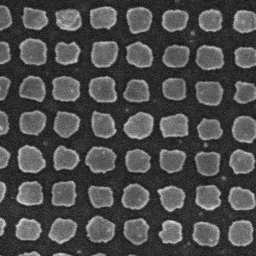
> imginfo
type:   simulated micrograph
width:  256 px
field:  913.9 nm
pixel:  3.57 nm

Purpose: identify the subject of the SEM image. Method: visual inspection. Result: a regular array of raised bodies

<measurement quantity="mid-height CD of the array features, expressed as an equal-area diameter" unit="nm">90.2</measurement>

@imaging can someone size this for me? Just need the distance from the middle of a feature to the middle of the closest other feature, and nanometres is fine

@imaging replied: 122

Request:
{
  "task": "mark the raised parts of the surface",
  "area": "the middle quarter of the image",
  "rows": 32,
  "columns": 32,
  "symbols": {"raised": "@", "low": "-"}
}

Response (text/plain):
--------@@@-------@@@------@@@--
--------------------------------
--------------------------------
@@-------@@@--------------------
@@@@---@@@@@----@@@@-----@@@@@--
@@@@--@@@@@@----@@@@@----@@@@@--
@@@@--@@@@@@@--@@@@@@----@@@@@--
@@@@---@@@@@@--@@@@@@----@@@@@--
@@@----@@@@@@--@@@@@@-----@@@@--
----------@@--------------------
--------------------------------
--------------------------------
@@-----@@@@-------@@@-------@@--
@@@@---@@@@@----@@@@@@----@@@@@-
@@@@---@@@@@----@@@@@@--@@@@@@@-
@@@@---@@@@@---@@@@@@@--@@@@@@@-
@@@----@@@@@@--@@@@@@@--@@@@@@@-
@@------@@@@----@@@@@----@@@@@@-
------------------@@------------
--------------------------------
--------------------------------
@@-----@@@@@------@-----@@------
@@@---@@@@@@@--@@@@@@---@@@@@@--
@@@---@@@@@@@--@@@@@@@--@@@@@@--
@@@--@@@@@@@---@@@@@@---@@@@@@--
@@@---@@@@@@@---@@@@@@--@@@@@---
-------@@@@@----@@@@@----@@@@---
--------------------------------
--------------------------------
-@------------------------------
@@@----@--------@@@-------------
@@@---@@@@@@---@@@@@@---@@@@@@--